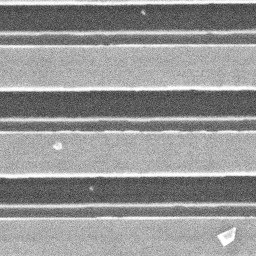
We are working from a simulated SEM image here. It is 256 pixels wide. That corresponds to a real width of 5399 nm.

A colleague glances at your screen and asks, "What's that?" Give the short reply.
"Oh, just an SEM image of lines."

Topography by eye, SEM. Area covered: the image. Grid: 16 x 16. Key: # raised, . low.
................
................
................
################
################
################
................
................
################
################
################
................
................
................
################
################